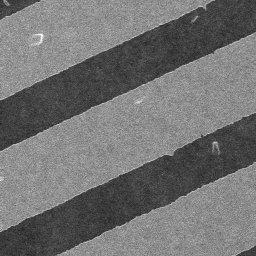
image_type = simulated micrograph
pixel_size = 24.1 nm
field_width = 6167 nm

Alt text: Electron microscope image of one or a few lines or trenches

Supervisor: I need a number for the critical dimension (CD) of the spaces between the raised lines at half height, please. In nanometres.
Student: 1110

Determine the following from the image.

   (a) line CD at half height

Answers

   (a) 1740 nm